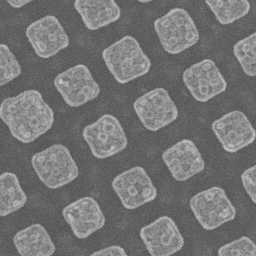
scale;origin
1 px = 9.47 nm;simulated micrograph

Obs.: a regular array of raised bodies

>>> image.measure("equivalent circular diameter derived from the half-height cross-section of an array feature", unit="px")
39.2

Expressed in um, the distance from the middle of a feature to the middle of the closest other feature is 0.535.